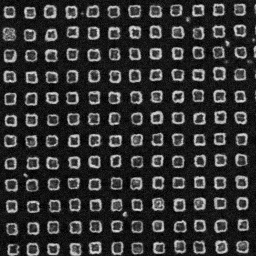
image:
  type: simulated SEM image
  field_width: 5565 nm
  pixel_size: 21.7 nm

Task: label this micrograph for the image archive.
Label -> a regular array of raised bodies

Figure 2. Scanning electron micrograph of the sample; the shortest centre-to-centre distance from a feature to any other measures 441 nm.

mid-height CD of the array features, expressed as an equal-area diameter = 254 nanometres